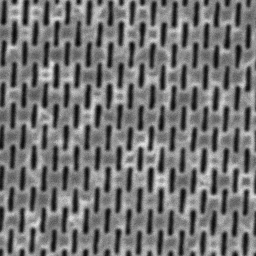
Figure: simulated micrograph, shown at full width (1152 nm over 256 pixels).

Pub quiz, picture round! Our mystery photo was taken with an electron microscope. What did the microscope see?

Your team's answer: a regular array of holes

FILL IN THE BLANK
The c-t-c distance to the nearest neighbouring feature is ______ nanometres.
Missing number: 94.8